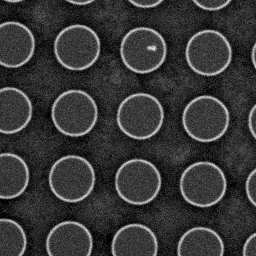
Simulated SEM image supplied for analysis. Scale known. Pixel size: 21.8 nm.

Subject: an array of small figures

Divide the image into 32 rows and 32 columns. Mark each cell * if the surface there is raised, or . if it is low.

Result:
.................***.....***....
................................
................................
***.....***.....................
****...*****....****....****....
****...*****...******...****....
****...*****...******..******...
***....*****...*****...******...
.........**.....***.....****....
................................
................................
***.....**......................
****...*****....***.....***.....
****...*****...*****...*****....
****...*****...*****...******..*
***....*****...*****...*****...*
**......***.....***....*****....
.........................*......
................................
**..............................
***....****.....***......*......
***...******...*****...*****....
***...******...*****...*****...*
***...*****....*****...*****...*
**.....****....****....*****...*
........................***.....
................................
*...............................
***....****....***..............
***...*****...*****....****.....
***...*****...******..******...*
***...*****...******..******...*